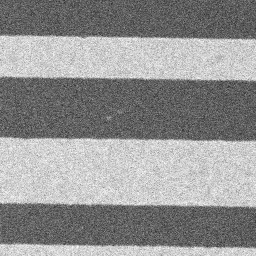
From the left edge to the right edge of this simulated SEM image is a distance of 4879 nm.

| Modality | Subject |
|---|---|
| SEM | one or a few lines or trenches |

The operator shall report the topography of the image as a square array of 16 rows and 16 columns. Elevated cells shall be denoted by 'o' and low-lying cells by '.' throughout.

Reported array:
................
................
ooooooooooooooo.
oooooooooooooooo
oooooooooooooooo
................
................
................
................
oooooooooooooooo
oooooooooooooooo
oooooooooooooooo
oooooooooooooooo
................
................
oooooooooooo....